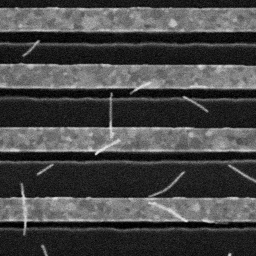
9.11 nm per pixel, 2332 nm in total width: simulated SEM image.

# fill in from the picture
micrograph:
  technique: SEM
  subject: lines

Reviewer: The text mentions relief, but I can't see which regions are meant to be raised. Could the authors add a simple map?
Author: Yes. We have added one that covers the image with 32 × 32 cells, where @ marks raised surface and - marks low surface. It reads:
--------------------------------
@@@@@@@@@@@@@@@@@@@@@@@@@@@@@@@@
@@@@@@@@@@@@@@@@@@@@@@@@@@@@@@@@
@@@@@@@@@@@@@@@@@@@@@@@@@@@@@@@@
--------------------------------
--------------------------------
--------------------------------
--------------------------------
@@@@@@@@@@@@@@@@@@@@@@@@@@@@@@@@
@@@@@@@@@@@@@@@@@@@@@@@@@@@@@@@@
@@@@@@@@@@@@@@@@@@@@@@@@@@@@@@@@
--------------------------------
--------------------------------
--------------------------------
--------------------------------
--------------------------------
@@@@@@@@@@@@@@@@@@@@@@@@@@@@@@@@
@@@@@@@@@@@@@@@@@@@@@@@@@@@@@@@@
@@@@@@@@@@@@@@@@@@@@@@@@@@@@@@@@
--------------------------------
--------------------------------
--------------------------------
--------------------------------
--------------------------------
--------------------------------
@@@@@@@@@@@@@@@@@@@@@@@@@@@@@@@@
@@@@@@@@@@@@@@@@@@@@@@@@@@@@@@@@
@@@@@@@@@@@@@@@@@@@@@@@@@@@@@@@@
--------------------------------
--------------------------------
--------------------------------
--------------------------------